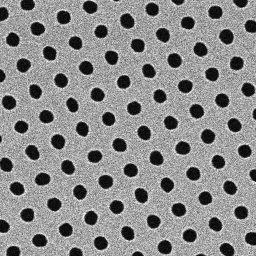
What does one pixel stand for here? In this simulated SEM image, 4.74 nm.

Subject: a regular array of holes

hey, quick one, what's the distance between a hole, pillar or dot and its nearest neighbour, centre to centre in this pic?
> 0.129 microns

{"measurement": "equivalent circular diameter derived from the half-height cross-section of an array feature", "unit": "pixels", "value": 13.8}